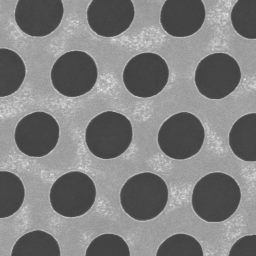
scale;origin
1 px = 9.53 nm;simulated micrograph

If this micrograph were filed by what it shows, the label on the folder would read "a regular array of holes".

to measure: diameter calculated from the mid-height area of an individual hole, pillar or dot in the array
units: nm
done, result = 441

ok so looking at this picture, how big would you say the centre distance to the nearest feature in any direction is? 668 nanometres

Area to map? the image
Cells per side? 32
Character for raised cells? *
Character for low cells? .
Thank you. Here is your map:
**......***......***.....****...
**......***......***......***...
**......***......***.....****...
**.....****.....****.....****...
****..*******.*******...******..
********************************
..*******.**********************
...****.....****....*****....***
...****.....****.....****.....**
...***......***......***......**
...****.....****.....***......**
..*****....*****....*****....***
********************************
********************************
***...******...******...******..
**.....****.....****.....****...
**.....****......***......***...
**.....****.....****......***...
**.....****.....****.....****...
****.*******...******...******..
********************************
.********.**********************
...****....*****....*****....***
...***......***......***......**
...***......***......***......**
...***......***......***......**
..*****....*****....****.....***
*****************.*******...****
********************************
***...******...******...*******.
**.....****.....****.....****...
**......***.....****.....****...